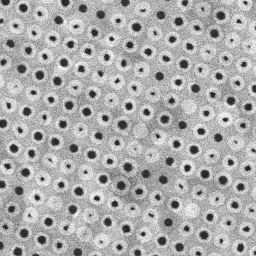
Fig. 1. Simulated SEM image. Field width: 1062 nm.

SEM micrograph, a regular array of holes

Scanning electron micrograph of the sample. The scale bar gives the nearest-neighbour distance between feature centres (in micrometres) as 0.0778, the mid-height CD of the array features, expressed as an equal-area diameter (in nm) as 35.4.